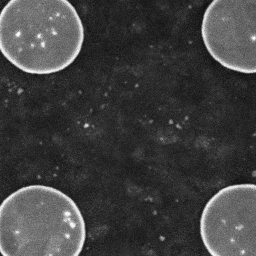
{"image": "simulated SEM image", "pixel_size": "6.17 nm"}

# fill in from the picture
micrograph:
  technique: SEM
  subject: raised bodies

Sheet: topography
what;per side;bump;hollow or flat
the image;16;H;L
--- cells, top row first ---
HHHHHLLLLLLLLHHH
HHHHHLLLLLLLLHHH
HHHHHLLLLLLLLHHH
HHHHHLLLLLLLLHHH
LLHLLLLLLLLLLLLL
LLLLLLLLLLLLLLLL
LLLLLLLLLLLLLLLL
LLLLLLLLLLLLLLLL
LLLLLLLLLLLLLLLL
LLLLLLLLLLLLLLLL
LLLLLLLLLLLLLLLL
LLLLLLLLLLLLLLLL
HHHHLLLLLLLLLHHH
HHHHHLLLLLLLLHHH
HHHHHLLLLLLLLHHH
HHHHHLLLLLLLLHHH